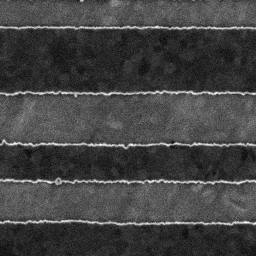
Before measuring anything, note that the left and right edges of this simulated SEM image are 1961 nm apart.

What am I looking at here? one or a few lines or trenches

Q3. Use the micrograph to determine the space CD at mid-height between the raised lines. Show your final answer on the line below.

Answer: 0.326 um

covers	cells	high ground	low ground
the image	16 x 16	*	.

................
................
****************
****************
****************
****************
................
................
................
****************
****************
................
................
................
****************
****************